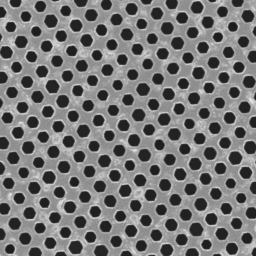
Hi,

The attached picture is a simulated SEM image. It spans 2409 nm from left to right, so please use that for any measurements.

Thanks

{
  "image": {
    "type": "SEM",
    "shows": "a regular array of holes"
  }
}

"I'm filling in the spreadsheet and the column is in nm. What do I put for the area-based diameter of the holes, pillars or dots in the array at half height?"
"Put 110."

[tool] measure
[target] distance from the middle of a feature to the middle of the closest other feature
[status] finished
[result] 170 nanometres